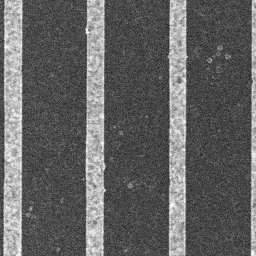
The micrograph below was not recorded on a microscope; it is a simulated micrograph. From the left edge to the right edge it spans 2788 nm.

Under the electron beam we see one or a few lines or trenches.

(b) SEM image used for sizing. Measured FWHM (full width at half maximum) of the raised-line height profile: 163 nanometres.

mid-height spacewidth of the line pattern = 730 nm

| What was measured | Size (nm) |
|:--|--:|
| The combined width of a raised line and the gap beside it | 895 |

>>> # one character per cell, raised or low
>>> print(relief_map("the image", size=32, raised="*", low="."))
.**........**........**.........
.**........**........**.........
.**........**........**.........
.**........**........**.........
.**........**........**.........
.**........**........**.........
.*.........**........**.........
.**........**........**.........
.**........**........**.........
.**........**........**.........
.**........**........**.........
.**........**........**.........
.**........**........**.........
.**........**........**.........
.**........**........**.........
.**........**........**.........
.**........**........**.........
.**........**........**.........
.**........**........**.........
.**........**........**.........
.**........**........**.........
.**........**........**.........
.**........**........**.........
.**........**........**.........
.**........**........**.........
.**........**........**.........
.**........**........**.........
.**........**........**.........
.**........**........**.........
.**........**........**.........
.**........**........**.........
.**........**........**.........